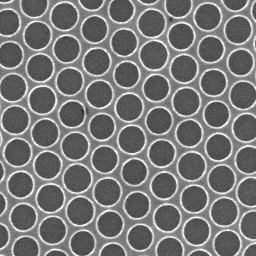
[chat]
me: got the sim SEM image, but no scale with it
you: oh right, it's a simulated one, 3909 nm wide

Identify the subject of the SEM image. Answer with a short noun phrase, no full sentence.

a regular array of holes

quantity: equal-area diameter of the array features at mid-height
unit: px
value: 26.6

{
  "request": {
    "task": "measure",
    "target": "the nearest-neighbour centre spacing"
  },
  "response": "495 nm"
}